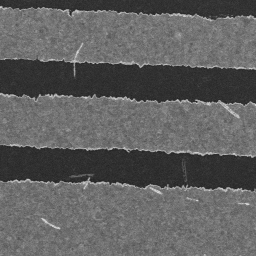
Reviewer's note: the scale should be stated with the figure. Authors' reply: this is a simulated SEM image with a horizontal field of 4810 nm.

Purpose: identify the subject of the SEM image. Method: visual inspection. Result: one or a few lines or trenches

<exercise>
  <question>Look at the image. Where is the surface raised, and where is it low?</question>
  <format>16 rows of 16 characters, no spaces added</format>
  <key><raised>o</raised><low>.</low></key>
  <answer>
o...............
oooooooooooooooo
oooooooooooooooo
oooooooooooooooo
................
................
oooooooooooooooo
oooooooooooooooo
oooooooooooooooo
..........oooooo
................
oooooooo........
oooooooooooooooo
oooooooooooooooo
oooooooooooooooo
oooooooooooooooo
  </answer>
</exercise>